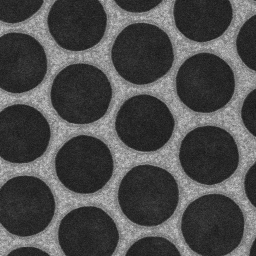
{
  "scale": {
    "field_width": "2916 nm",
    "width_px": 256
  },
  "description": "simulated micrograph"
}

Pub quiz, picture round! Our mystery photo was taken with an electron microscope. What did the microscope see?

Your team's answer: holes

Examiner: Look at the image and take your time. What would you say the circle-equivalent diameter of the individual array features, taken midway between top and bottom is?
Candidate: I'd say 682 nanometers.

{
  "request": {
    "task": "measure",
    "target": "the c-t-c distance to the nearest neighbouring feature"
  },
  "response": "796 nm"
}